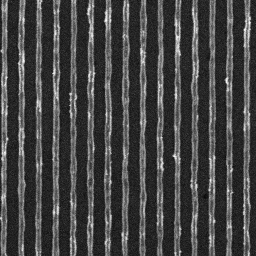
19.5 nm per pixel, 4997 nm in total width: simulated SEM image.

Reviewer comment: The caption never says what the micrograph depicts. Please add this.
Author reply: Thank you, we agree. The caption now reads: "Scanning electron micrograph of parallel lines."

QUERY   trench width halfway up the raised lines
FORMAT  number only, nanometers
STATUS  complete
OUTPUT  251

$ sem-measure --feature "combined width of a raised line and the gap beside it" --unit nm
338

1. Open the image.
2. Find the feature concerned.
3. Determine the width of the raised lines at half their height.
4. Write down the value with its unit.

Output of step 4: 97.6 nanometers